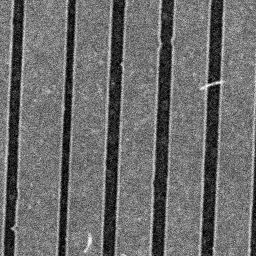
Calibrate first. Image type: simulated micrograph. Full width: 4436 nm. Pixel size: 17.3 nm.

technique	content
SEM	parallel lines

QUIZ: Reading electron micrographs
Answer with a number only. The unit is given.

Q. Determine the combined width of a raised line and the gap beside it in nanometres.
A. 846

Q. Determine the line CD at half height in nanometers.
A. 610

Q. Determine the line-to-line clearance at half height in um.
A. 0.229